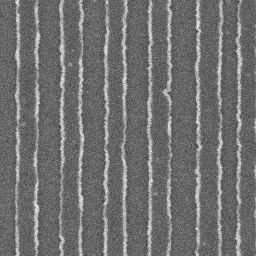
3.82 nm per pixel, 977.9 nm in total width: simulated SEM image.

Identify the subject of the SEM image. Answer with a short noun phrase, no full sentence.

parallel lines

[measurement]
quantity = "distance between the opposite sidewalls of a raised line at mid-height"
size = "83.7 nm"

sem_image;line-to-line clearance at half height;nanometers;87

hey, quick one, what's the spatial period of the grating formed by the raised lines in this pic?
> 174 nm